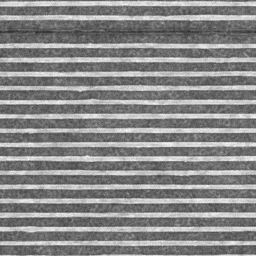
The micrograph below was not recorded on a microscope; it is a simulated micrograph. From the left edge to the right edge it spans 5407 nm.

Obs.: parallel lines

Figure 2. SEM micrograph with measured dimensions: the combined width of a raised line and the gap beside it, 0.297 microns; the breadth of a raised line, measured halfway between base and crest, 3.87 px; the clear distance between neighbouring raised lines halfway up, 219 nm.